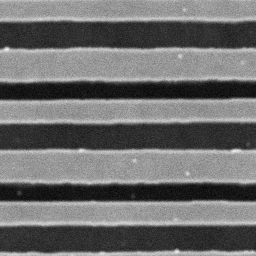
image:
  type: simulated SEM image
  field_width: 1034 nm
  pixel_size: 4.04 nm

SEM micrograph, lines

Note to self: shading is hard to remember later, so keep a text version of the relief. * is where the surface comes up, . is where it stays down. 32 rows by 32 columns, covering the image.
********************************
********************************
*********************.**********
................................
................................
................................
********************************
********************************
********************************
********************************
................................
................................
......................*.....****
********************************
********************************
................................
................................
................................
................................
********************************
********************************
********************************
********************************
................................
................................
********************************
********************************
********************************
................................
................................
................................
.....................**...*...**